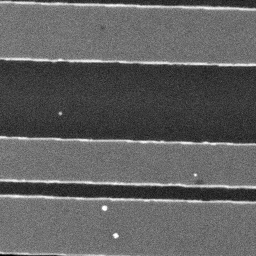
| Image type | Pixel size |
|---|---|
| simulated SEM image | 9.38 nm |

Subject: lines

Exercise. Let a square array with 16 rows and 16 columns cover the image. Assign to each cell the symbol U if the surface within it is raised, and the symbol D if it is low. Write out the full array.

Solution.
UUUUUUUUUUUUUUUU
UUUUUUUUUUUUUUUU
UUUUUUUUUUUUUUUU
UUUUUUUUUUUUUUUU
DDDDDDDDDDDDDDDD
DDDDDDDDDDDDDDDD
DDDDDDDDDDDDDDDD
DDDDDDDDDDDDDDDD
DDDDDDDDDDDDDDDD
UUUUUUUUUUUUUUUU
UUUUUUUUUUUUUUUU
UUUUUUUUUUUUUUUU
UUUUUUUUUUUUUUUU
UUUUUUUUUUUUUUUU
UUUUUUUUUUUUUUUU
UUUUUUUUUUUUUUUU